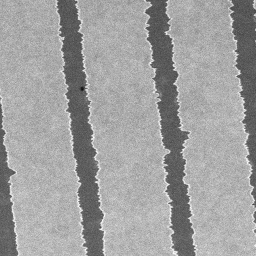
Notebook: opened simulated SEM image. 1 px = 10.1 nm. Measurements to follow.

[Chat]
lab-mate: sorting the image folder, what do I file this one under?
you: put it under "one or a few lines or trenches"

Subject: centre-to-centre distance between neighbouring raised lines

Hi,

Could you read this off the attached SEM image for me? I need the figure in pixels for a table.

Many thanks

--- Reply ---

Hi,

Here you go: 86.9